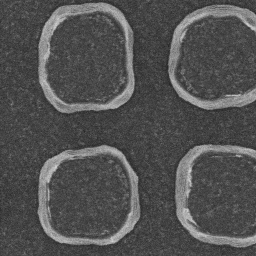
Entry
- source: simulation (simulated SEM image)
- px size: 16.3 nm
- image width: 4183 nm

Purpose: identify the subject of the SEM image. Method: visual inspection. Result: raised bodies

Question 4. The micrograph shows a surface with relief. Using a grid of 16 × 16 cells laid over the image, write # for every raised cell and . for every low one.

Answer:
.....##.........
...#####....####
...#####...#####
...#####...#####
...#####...#####
...#####...#####
....###......#..
................
................
......#.....####
...#####....####
...#####...#####
...#####...#####
...#####...#####
...#####....####
................